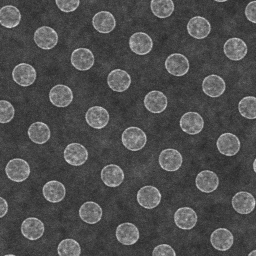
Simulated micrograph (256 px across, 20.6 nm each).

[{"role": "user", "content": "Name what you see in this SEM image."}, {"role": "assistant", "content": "a regular array of raised bodies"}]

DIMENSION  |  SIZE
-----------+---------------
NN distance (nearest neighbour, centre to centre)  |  0.869 um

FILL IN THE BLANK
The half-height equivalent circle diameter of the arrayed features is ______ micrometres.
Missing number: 0.459